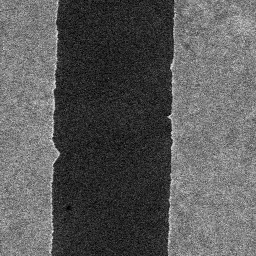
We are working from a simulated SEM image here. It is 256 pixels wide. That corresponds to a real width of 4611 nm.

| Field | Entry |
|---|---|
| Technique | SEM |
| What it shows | one or a few lines or trenches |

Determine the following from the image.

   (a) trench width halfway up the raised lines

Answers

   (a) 2.11 um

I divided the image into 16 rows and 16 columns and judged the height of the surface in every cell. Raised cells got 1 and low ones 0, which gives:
1111000000011111
1111000000011111
1111000000011111
1111000000011111
1110000000011111
1110000000011111
1110000000011111
1110000000011111
1110000000011111
1111000000011111
1110000000011111
1110000000011111
1110000000011111
1110000000011111
1110000000011111
1110000000011111